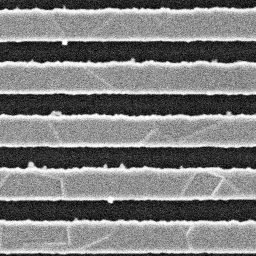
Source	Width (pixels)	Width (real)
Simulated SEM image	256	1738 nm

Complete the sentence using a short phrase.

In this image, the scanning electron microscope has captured lines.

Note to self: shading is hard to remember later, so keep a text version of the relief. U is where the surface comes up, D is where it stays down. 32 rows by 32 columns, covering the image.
DDDDDDDDDDDDDDDDDDDDDDDDDDDDDDDD
UUUUUUUUUUUUUUUUUUUUUUUUUUUUUUUU
UUUUUUUUUUUUUUUUUUUUUUUUUUUUUUUU
UUUUUUUUUUUUUUUUUUUUUUUUUUUUUUUU
UUUUUUUUUUUUUUUUUUUUUUUUUUUUUUUU
DDDDDDDDDDDDDDDDDDDDDDDDDDDDDDDD
DDDDDDDDDDDDDDDDDDDDDDDDDDDDDDDD
DDDDDDDDDDDDDDDDDDDDDDDDDDDDDDDD
UUUUUUUUUUUUUUUUUUUUUUUUUUUUUUUU
UUUUUUUUUUUUUUUUUUUUUUUUUUUUUUUU
UUUUUUUUUUUUUUUUUUUUUUUUUUUUUUUU
UUUUUUUUUUUUUUUUUUUUUUUUUUUUUUUU
DDDDDDDDDDDDDDDDDDDDDDDDDDDDDDDD
DDDDDDDDDDDDDDDDDDDDDDDDDDDDDDDD
UUUUUUUUUUUUUUUUDDUUUUUUUUUUUUUU
UUUUUUUUUUUUUUUUUUUUUUUUUUUUUUUU
UUUUUUUUUUUUUUUUUUUUUUUUUUUUUUUU
UUUUUUUUUUUUUUUUUUUUUUUUUUUUUUUU
DDDDDDDDDDDDDDDDDDDDDDDDDDDDDDDD
DDDDDDDDDDDDDDDDDDDDDDDDDDDDDDDD
DDDDDDDDDDDDDDDDDDDDDDDDDDDDDDDD
UUUUUUUUUUUUUUUUUUUUUUUUUUUUUUUU
UUUUUUUUUUUUUUUUUUUUUUUUUUUUUUUU
UUUUUUUUUUUUUUUUUUUUUUUUUUUUUUUU
UUUUUUUUUUUUUUUUUUUUUUUUUUUUUUUU
DDDDDDDDDDDDDDDDDDDDDDDDDDDDDDDD
DDDDDDDDDDDDDDDDDDDDDDDDDDDDDDDD
DDDDDDDDDDDDDDDDDDDDDDDDDDDDDDDD
UUUUUUUUUUUUUUUUUUUUUUUUUUUUUUUU
UUUUUUUUUUUUUUUUUUUUUUUUUUUUUUUU
UUUUUUUUUUUUUUUUUUUUUUUUUUUUUUUU
UUUUUUUUUUUUUUUUUUUUUUUUUUUUUUUU